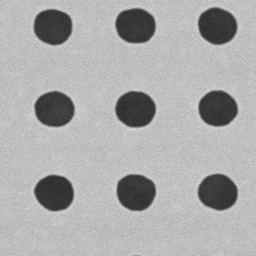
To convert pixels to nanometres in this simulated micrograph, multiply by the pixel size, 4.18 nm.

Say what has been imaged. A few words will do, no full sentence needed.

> a regular array of holes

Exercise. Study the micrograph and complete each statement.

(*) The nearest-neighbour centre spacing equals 342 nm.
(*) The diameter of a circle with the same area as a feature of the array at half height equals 160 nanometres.